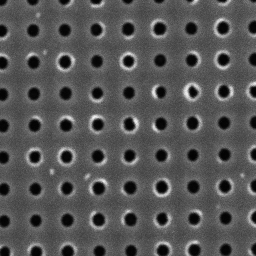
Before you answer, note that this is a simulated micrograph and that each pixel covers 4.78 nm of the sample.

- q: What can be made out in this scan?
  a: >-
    a regular array of holes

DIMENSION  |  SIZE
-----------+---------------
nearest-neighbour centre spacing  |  150 nm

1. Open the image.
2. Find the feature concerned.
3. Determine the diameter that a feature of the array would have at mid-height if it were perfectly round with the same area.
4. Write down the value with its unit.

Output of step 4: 62.2 nm